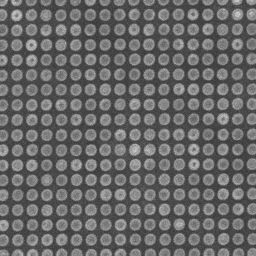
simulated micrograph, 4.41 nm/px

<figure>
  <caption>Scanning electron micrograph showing a regular array of raised bodies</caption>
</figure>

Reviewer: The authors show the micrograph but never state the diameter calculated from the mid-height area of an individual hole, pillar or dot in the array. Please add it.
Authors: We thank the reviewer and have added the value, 10.8 px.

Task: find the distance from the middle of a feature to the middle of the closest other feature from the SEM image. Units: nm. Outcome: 64.2